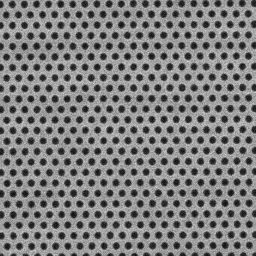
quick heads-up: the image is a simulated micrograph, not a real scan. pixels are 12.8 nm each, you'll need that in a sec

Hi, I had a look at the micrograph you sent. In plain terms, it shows a regular array of holes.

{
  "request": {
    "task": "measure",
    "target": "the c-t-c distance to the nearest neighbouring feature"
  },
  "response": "0.153 um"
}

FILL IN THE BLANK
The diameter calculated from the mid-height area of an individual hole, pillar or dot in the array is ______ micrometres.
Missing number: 0.0961